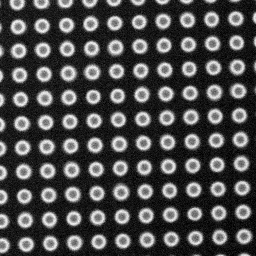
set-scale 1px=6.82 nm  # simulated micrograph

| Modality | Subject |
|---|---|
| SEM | an array of small figures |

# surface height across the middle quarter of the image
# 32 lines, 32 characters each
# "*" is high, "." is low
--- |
**....**....***...***..****...**
***..****..****..****..****...**
***..****..****..****...***...**
***...***...**....**............
................................
................................
.*...........*....***...***...**
***...***...***...***...***...**
***...***...***...***...***...**
***...**....***....*............
................................
...............................*
.......*....***...***...****..**
***...***...***...****..****..**
***...***...***...****..***...**
***...***....*.....**...........
................................
................................
.......*....***...***...***...**
***...***...****..****..****..**
****..****..****..****..****..**
***...***...***....**....*......
................................
................................
.*...........**....**...****...*
****..****..****..****..****..**
****..****..****..****..****...*
****...***...**....**...........
.*..............................
................................
.............***...***...***...*
****...***..****..****...***...*